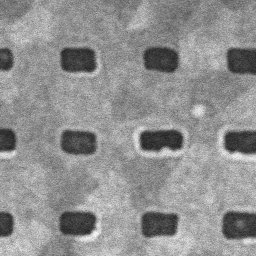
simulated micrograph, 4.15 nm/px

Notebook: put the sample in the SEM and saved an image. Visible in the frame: holes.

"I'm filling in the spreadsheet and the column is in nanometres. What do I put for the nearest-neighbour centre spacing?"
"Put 334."